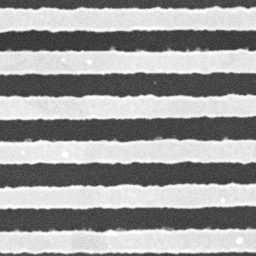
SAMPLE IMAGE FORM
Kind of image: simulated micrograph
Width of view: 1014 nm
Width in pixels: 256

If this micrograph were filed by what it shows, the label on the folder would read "lines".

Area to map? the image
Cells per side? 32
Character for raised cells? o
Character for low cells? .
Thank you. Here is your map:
................................
oooooooooooooooooooooooooooooooo
oooooooooooooooooooooooooooooooo
oooooooooooooooooooooooooooooooo
................................
................................
oooooooooooooooo.oo.oooooooooooo
oooooooooooooooooooooooooooooooo
oooooooooooooooooooooooooooooooo
................................
................................
................................
oooooooooooooooooooooooooooooooo
oooooooooooooooooooooooooooooooo
ooooooooooooooooooooooooo.ooooo.
................................
................................
.....................o..........
oooooooooooooooooooooooooooooooo
oooooooooooooooooooooooooooooooo
................................
................................
................................
oooooooooooooooooooooooooooooooo
oooooooooooooooooooooooooooooooo
oooooooooooooooooooooooooooooooo
................................
................................
................................
oooooooooooooooooooooooooooooooo
oooooooooooooooooooooooooooooooo
oooooo.ooo.ooooooo.oooooooo.....